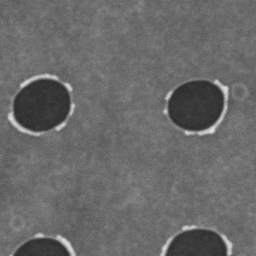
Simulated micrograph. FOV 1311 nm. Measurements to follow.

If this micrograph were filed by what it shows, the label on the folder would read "holes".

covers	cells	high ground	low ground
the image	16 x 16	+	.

++++++++++++++++
++++++++++++++++
++++++++++++++++
++++++++++++++++
++++++++++++++++
+...+++++++...++
+...++++++....++
+...+++++++...++
++++++++++++++++
++++++++++++++++
++++++++++++++++
++++++++++++++++
++++++++++++++++
++++++++++++++++
+++++++++++..+++
+...++++++....++